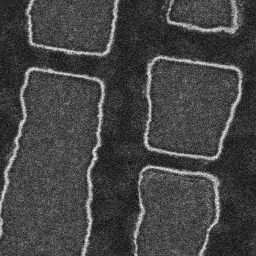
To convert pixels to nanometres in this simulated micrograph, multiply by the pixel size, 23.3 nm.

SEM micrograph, one or a few lines or trenches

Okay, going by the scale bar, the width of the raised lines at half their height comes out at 1170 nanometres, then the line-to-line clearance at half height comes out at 1840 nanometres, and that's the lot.